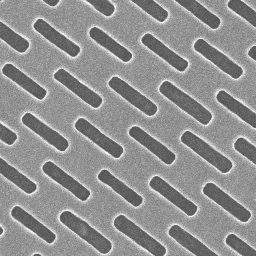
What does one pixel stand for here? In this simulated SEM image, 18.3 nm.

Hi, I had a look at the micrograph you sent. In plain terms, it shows a regular array of holes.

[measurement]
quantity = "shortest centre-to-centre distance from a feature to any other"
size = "979 nm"